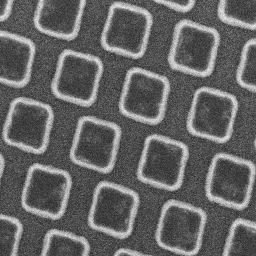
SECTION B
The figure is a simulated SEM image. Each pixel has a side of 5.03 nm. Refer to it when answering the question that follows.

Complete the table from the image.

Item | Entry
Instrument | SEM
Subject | a regular array of raised bodies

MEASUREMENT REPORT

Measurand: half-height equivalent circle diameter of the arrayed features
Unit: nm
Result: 248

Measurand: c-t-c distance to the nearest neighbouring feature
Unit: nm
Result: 343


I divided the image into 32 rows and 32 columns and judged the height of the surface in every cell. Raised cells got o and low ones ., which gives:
o....ooooo...........ooo....oooo
o....ooooo....oooo..........oooo
.....ooooo...oooooo.........oooo
.....ooooo...oooooo...oooo......
oo.....oo....ooooo....ooooo.....
oooo.........ooooo....ooooo....o
oooo....o......ooo...oooooo...oo
oooo....oooo.........oooooo...oo
oooo...oooooo.........oooo....oo
oooo...ooooo....oooo..........oo
..o....ooooo....ooooo.........oo
.......ooooo...oooooo....oo.....
..o......ooo...oooooo...ooooo...
.ooooo.........ooooo....ooooo...
.ooooo..........oooo....ooooo...
.ooooo....oooo..........ooooo...
.ooooo....ooooo.........ooooo...
.ooooo...oooooo...ooo......o....
...oo....oooooo...ooooo.........
.........ooooo....ooooo....o....
..........oooo....ooooo....oooo.
....oooo.........oooooo...oooooo
...oooooo.........ooooo...oooooo
...oooooo...ooo......o....ooooo.
...ooooo....ooooo.........ooooo.
...ooooo....ooooo....oo.....ooo.
....oooo...oooooo...ooooo.......
oo.........oooooo...ooooo.......
ooo.........oooo....ooooo....ooo
oo....ooo......o....ooooo....ooo
oo....ooooo.........ooooo...oooo
oo...oooooo....o......oo....oooo